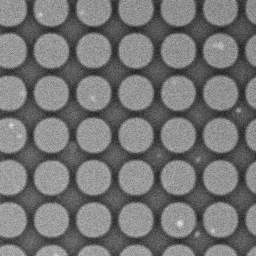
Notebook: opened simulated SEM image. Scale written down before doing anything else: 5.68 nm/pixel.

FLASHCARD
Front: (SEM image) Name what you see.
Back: an array of small figures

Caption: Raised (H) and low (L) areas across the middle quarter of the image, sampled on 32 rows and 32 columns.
LLLLLLHHHLLLLLLLHHHHLLLLLLLHHHLL
LLLLLLLLLLLLLLLLLLLLLLLLLLLLLLLL
LLLLLLLLLLLLLLLLLLLLLLLLLLLLLLLL
LLLLLLHHHLLLLLLLHHHHLLLLLLLHHHLL
LLLLHHHHHHHLLLLHHHHHHLLLLHHHHHHH
HLLLHHHHHHHLLLHHHHHHHHLLLHHHHHHH
HLLHHHHHHHHHLLHHHHHHHHLLHHHHHHHH
HLLHHHHHHHHHLLHHHHHHHHLLHHHHHHHH
HLLHHHHHHHHHLLHHHHHHHHLLLHHHHHHH
LLLLHHHHHHHLLLHHHHHHHHLLLHHHHHHH
LLLLLHHHHHLLLLLHHHHHHLLLLLHHHHHL
LLLLLLLLLLLLLLLLLLLLLLLLLLLLHLLL
LLLLLLLLLLLLLLLLLLLLLLLLLLLLLLLL
LLLLLLLLLLLLLLLLLLLLLLLLLLLLLLLL
LLLLLHHHHHLLLLLHHHHHHLLLLLHHHHHL
LLLLHHHHHHHLLLHHHHHHHHLLLHHHHHHH
HLLHHHHHHHHLLLHHHHHHHHLLLHHHHHHH
HLLHHHHHHHHHLLHHHHHHHHLLHHHHHHHH
HLLHHHHHHHHHLLHHHHHHHHLLHHHHHHHH
HLLLHHHHHHHLLLHHHHHHHHLLLHHHHHHH
LLLLHHHHHHHLLLLHHHHHHLLLLHHHHHHH
LLLLLHHHHHLLLLLLHHHHLLLLLLLHHHHL
LLLLLLLLLLLLLLLLLLLLLLLLLLLLLLLL
LLLLLLLLLLLLLLLLLLLLLLLLLLLLLLLL
LLLLLLHHHLLLLLLLHHHHLLLLLLLHHHLL
LLLLHHHHHHHLLLLHHHHHHLLLLHHHHHHH
HLLLHHHHHHHLLLHHHHHHHHLLLHHHHHHH
HLLHHHHHHHHHLLHHHHHHHHLLHHHHHHHH
HLLHHHHHHHHHLLHHHHHHHHLLHHHHHHHH
HLLHHHHHHHHHLLHHHHHHHHLLLHHHHHHH
LLLLHHHHHHHLLLHHHHHHHHLLLHHHHHHH
LLLLHHHHHHLLLLLHHHHHHLLLLLHHHHHL